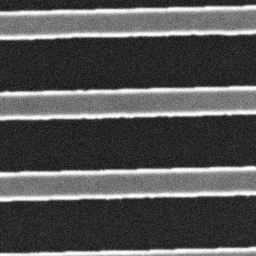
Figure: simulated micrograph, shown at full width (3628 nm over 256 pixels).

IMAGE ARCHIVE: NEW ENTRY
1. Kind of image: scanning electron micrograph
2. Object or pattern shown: lines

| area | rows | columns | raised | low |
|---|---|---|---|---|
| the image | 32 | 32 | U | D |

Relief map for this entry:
DDDDDDDDDDDDDDDDDDDDDDDDDDDDDDDD
DDDUUUUUUUUUUUUUUUUUUUUUUUUUUUUU
UUUUUUUUUUUUUUUUUUUUUUUUUUUUUUUU
UUUUUUUUUUUUUUUUUUUUUUUUUUUUUUUU
UUUUUUUUUUUUUUUUDDDDDDDDDDDDDDDD
DDDDDDDDDDDDDDDDDDDDDDDDDDDDDDDD
DDDDDDDDDDDDDDDDDDDDDDDDDDDDDDDD
DDDDDDDDDDDDDDDDDDDDDDDDDDDDDDDD
DDDDDDDDDDDDDDDDDDDDDDDDDDDDDDDD
DDDDDDDDDDDDDDDDDDDDDDDDDDDDDDDD
DDDDDDDDDDDDDDDDDDDDDDDDDDDDDDDD
DDDDDUUUUUUUUUUUUUUUUUUUUUUUUUUU
UUUUUUUUUUUUUUUUUUUUUUUUUUUUUUUU
UUUUUUUUUUUUUUUUUUUUUUUUUUUUUUUU
UUUUUUUUUUUUUUDDDDDDDDDDDDDDDDDD
DDDDDDDDDDDDDDDDDDDDDDDDDDDDDDDD
DDDDDDDDDDDDDDDDDDDDDDDDDDDDDDDD
DDDDDDDDDDDDDDDDDDDDDDDDDDDDDDDD
DDDDDDDDDDDDDDDDDDDDDDDDDDDDDDDD
DDDDDDDDDDDDDDDDDDDDDDDDDDDDDDDD
DDDDDDDDDDDDDDDDDDDDDDDDDDDDDDDD
DDDDDDDDDUUUUUUUUUUUUUUUUUUUUUUU
UUUUUUUUUUUUUUUUUUUUUUUUUUUUUUUU
UUUUUUUUUUUUUUUUUUUUUUUUUUUUUUUU
UUUUUUUUUUUUUUUUUUDDDDDDDDDDDDDD
DDDDDDDDDDDDDDDDDDDDDDDDDDDDDDDD
DDDDDDDDDDDDDDDDDDDDDDDDDDDDDDDD
DDDDDDDDDDDDDDDDDDDDDDDDDDDDDDDD
DDDDDDDDDDDDDDDDDDDDDDDDDDDDDDDD
DDDDDDDDDDDDDDDDDDDDDDDDDDDDDDDD
DDDDDDDDDDDDDDDDDDDDDDDDDDDDDDDD
DDDDDDDDDDDDDDUUUUUUUUUUUUUUUUUU